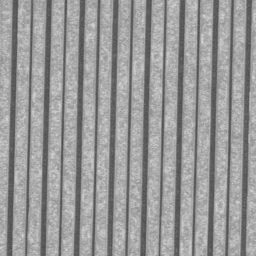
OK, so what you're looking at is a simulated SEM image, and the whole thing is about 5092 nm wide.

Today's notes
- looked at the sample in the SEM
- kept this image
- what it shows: parallel lines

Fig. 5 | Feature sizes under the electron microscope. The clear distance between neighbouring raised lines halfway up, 117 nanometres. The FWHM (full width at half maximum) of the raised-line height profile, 249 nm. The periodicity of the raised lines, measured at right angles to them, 329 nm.